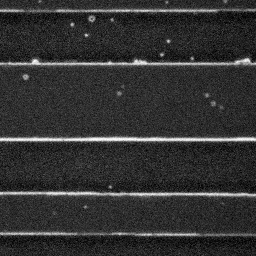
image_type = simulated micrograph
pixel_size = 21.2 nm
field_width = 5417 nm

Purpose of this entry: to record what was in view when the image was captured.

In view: lines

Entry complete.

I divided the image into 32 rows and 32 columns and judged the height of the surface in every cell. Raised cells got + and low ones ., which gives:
++++++++++++++++++++++++++++++++
................................
................................
................................
................................
................................
................................
................................
++++++++++++++++++++++++++++++++
++++++++++++++++++++++++++++++++
++++++++++++++++++++++++++++++++
++++++++++++++++++++++++++++++++
++++++++++++++++++++++++++++++++
++++++++++++++++++++++++++++++++
++++++++++++++++++++++++++++++++
++++++++++++++++++++++++++++++++
++++++++++++++++++++++++++++++++
................................
................................
................................
................................
................................
................................
................................
++++++++++++++++++++++++++++++++
++++++++++++++++++++++++++++++++
++++++++++++++++++++++++++++++++
++++++++++++++++++++++++++++++++
++++++++++++++++++++++++++++++++
................................
................................
................................